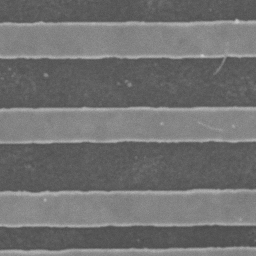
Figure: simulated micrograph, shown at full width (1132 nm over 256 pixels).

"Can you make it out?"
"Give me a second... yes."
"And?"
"lines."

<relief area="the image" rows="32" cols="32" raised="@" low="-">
--------------------------------
--------------------------------
--------------------------------
@@@@@@@@@@@@@@@@@@@@@@@@@@@@@@@@
@@@@@@@@@@@@@@@@@@@@@@@@@@@@@@@@
@@@@@@@@@@@@@@@@@@@@@@@@@@@@@@@@
@@@@@@@@@@@@@@@@@@@@@@@@@@@@@@@@
--------------------------------
--------------------------------
--------------------------------
--------------------------------
--------------------------------
--------------------------------
----------@-----@@@-----@@@@@@@@
@@@@@@@@@@@@@@@@@@@@@@@@@@@@@@@@
@@@@@@@@@@@@@@@@@@@@@@@@@@@@@@@@
@@@@@@@@@@@@@@@@@@@@@@@@@@@@@@@@
@@@@@@@@@@@@@@@@@@@@@@@@@@@@@@@@
--------------------------------
--------------------------------
--------------------------------
--------------------------------
--------------------------------
--------------------------------
@@@@@@@@@@@@@@@@@@@@@@@@@@@@@@@@
@@@@@@@@@@@@@@@@@@@@@@@@@@@@@@@@
@@@@@@@@@@@@@@@@@@@@@@@@@@@@@@@@
@@@@@@@@@@@@@@@@@@@@@@@@@@@@@@@@
--------------------------------
--------------------------------
--------------------------------
@@@@@@@@@@@@@@@@@@@@@@@@@@@@@@@@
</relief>